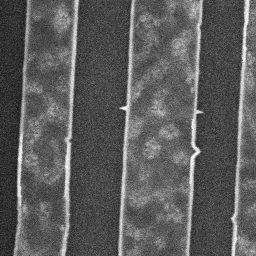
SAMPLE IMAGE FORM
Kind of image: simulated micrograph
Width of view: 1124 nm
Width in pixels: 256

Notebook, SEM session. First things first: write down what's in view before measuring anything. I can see one or a few lines or trenches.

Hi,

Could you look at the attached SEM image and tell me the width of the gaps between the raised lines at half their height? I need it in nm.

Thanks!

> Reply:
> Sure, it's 207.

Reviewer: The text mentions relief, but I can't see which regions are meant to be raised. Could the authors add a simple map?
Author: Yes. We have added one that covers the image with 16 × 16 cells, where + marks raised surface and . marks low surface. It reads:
..+++...+++++..+
..+++...+++++..+
..+++...++++...+
..+++...++++...+
.++++...++++...+
.+++....++++...+
.+++....++++...+
.+++....++++...+
.+++....++++...+
.+++....++++...+
.+++....++++...+
.+++....++++...+
.+++....++++...+
.+++....++++...+
.+++....++++...+
.+++...+++++...+